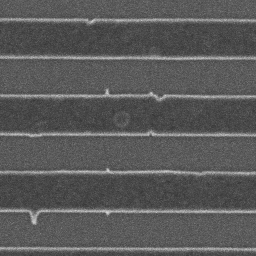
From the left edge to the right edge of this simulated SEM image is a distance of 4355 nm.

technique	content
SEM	one or a few lines or trenches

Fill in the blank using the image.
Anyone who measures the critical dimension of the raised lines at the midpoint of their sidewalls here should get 40.1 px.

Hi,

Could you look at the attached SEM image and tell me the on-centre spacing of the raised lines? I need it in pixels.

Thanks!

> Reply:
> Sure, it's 76.4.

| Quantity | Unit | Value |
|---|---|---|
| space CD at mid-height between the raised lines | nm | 623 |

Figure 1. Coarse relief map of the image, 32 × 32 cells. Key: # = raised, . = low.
................................
................................
###########.########......#.....
################################
################################
################################
################################
................................
................................
................................
................................
................................
################################
################################
################################
################################
################################
................................
................................
................................
................................
##....#############.#...........
################################
################################
################################
################################
....#........#...####...........
................................
................................
................................
................................
################################